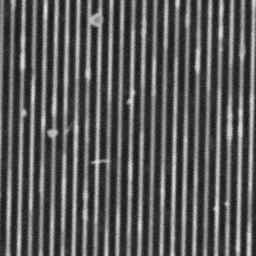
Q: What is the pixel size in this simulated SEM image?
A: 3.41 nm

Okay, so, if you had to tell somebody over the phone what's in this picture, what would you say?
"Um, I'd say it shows parallel lines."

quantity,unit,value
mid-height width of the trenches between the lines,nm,26.4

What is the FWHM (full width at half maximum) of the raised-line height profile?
8.9 nanometers